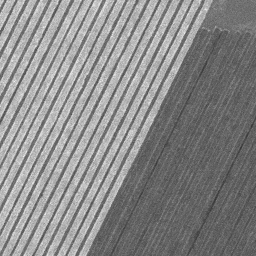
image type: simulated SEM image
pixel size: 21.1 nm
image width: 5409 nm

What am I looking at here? parallel lines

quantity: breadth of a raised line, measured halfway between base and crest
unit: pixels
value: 6.39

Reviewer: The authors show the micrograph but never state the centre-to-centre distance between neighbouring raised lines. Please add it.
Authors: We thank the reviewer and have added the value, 209 nm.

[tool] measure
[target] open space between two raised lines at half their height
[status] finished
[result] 78.1 nm